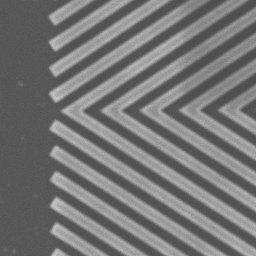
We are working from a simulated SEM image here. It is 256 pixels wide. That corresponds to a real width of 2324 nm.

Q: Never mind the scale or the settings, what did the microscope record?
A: groups of lines, slits or small figures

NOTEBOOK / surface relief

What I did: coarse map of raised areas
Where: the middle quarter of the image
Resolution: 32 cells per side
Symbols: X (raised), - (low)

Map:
XX-----XXXX------XXXX-----XXXXX-
-----XXXXX-----XXXX------XXXX---
----XXXX------XXXX-----XXXXX----
---XXXX-----XXXX------XXXX------
-XXXX-----XXXXX-----XXXX------XX
XXXX-----XXXX------XXXX------XXX
XX------XXXX-----XXXXX-----XXXX-
X-----XXXX------XXXX-----XXXXX--
-----XXXX-----XXXXX-----XXXX----
---XXXX------XXXX------XXXX-----
--XXXX-----XXXXX-----XXXX------X
XXXXX-----XXXX------XXXX-----XXX
-XXXX------XXXX------XXXX-----XX
--XXXXX-----XXXXX-----XXXXX-----
----XXXX------XXXX------XXXX----
------XXXX-----XXXXX-----XXXXX--
XX-----XXXX------XXXX------XXXX-
XXX-----XXXXX-----XXXXX-----XXXX
XXXXX-----XXXXX-----XXXX------XX
--XXXX------XXXX-----XXXXX-----X
---XXXX------XXXX------XXXX-----
-----XXXX------XXXX------XXXX---
X-----XXXXX-----XXXXX-----XXXX--
XX------XXXX------XXXX------XXXX
XXXX------XXXX-----XXXXX-----XXX
-XXXX------XXXX------XXXX------X
---XXXX------XXXX------XXXX-----
----XXXXX-----XXXXX-----XXXX----
------XXXX------XXXX-----XXXXX--
XX-----XXXXX-----XXXXX-----XXXXX
XXX------XXXX------XXXX------XXX
XXXXX-----XXXXX-----XXXX------XX